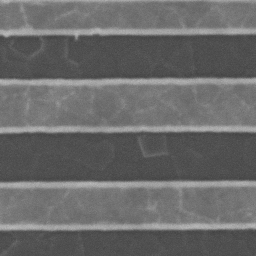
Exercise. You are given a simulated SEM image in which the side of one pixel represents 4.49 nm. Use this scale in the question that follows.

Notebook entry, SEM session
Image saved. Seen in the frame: one or a few lines or trenches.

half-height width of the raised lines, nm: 204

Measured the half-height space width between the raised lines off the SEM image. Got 234 nm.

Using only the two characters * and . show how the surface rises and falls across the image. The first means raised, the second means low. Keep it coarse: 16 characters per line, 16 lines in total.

****************
****************
................
................
................
****************
****************
****************
................
................
................
.........*...***
****************
****************
................
................